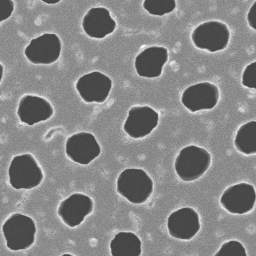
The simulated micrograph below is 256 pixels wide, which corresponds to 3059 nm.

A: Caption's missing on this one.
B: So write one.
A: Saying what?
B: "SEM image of a regular array of holes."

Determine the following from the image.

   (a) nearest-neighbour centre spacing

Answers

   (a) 720 nm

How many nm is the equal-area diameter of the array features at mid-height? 382